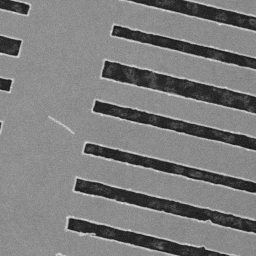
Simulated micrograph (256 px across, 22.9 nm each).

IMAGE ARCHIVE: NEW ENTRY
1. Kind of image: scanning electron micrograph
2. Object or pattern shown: parallel lines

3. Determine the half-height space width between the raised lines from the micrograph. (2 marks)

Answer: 290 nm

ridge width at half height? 605 nm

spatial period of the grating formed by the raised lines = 907 nm